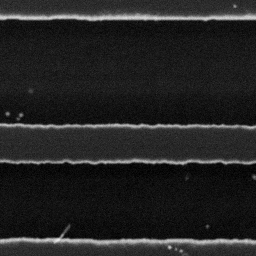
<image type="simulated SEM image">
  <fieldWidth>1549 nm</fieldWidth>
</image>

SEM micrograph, lines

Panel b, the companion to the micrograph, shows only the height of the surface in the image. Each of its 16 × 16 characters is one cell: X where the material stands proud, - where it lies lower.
XXXXXXXXXXXXXXXX
----------------
----------------
----------------
----------------
----------------
----------------
----------------
XXXXXXXXXXXXXXXX
XXXXXXXXXXXXXXXX
----------------
----------------
----------------
----------------
----------------
XXXXXXXXXXXXXXXX